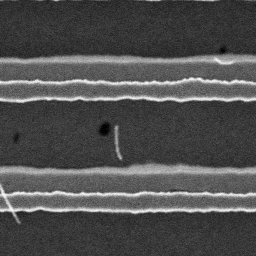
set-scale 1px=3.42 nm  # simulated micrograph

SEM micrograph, lines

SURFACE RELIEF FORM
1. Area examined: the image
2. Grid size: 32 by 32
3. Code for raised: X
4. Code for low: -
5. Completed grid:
--------------------------------
--------------------------------
--------------------------------
--------------------------------
--------------------------------
--------------------------------
--------------------------------
-X--XXXXXXXXXXX-XXXXXXXXXXXXXXXX
XXXXXXXXXXXXXXXXXXXXXXXXXXXXXXXX
XXXXXXXXXXXXXXXXXXXXXXXXXXXXXXXX
XXXXXXXXXXXXXXXXXXXXXXXXXXXXXXXX
XXXXXXXXXXXXXXXXXXXXXXXXXXXXXXXX
XXXX---------------XX-XX----X-XX
--------------------------------
--------------------------------
--------------------------------
--------------------------------
--------------------------------
--------------------------------
--------------------------------
--------------------------------
XXXX--XXXXXXXXX-XXXXXXXXXXXXXXXX
XXXXXXXXXXXXXXXXXXXXXXXXXXXXXXXX
XXXXXXXXXXXXXXXXXXXXXXXXXXXXXXXX
XXXXXXXXXXXXXXXXXXXXXXXXXXXXXXXX
XXXXXXXXXXXXXXXXXXXXXXXXXXXXXXXX
-X--------------XX--------------
--------------------------------
--------------------------------
--------------------------------
--------------------------------
--------------------------------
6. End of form